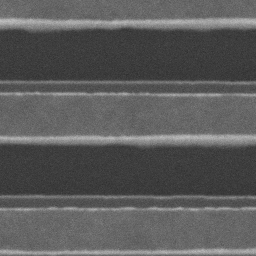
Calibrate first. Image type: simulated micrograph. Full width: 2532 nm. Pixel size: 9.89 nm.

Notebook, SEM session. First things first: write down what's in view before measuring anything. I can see lines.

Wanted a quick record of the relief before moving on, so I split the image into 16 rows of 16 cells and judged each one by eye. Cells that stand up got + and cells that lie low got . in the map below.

++++++++++++++++
+...+...........
................
................
................
++++++++++++++++
++++++++++++++++
++++++++++++++++
++++++++++++++++
................
................
................
++++++++++++++++
++++++++++++++++
++++++++++++++++
++++++++++++++++